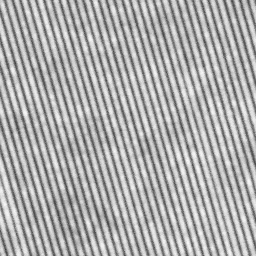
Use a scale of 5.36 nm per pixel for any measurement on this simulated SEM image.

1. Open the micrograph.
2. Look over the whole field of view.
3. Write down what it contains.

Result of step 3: parallel lines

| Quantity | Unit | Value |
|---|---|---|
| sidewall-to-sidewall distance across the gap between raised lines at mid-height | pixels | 1.92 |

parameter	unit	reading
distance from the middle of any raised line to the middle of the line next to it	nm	40.4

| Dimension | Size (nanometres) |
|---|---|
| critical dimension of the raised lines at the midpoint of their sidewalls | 31.6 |